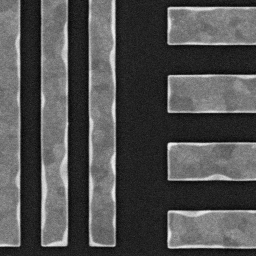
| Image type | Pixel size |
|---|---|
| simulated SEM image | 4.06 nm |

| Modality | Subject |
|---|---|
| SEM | groups of lines, slits or small figures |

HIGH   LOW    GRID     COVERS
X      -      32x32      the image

XX---XXX---XXX------------------
XX---XXX---XXX-------XXXXXXXXXXX
XX---XXX---XXX-------XXXXXXXXXXX
XX---XXX---XXX-------XXXXXXXXXXX
XX---XXX---XXX-------XXXXXXXXXXX
XX---XXX---XXX-------XX--XX-XXXX
XX---XXX---XXX------------------
XX---XXX---XXX------------------
XX---XXX---XXX------------------
XX---XXX---XXX-------XXXXXXXXX--
XX---XXX---XXX-------XXXXXXXXXXX
XX---XXX---XXX-------XXXXXXXXXXX
XX---XXX---XXX-------XXXXXXXXXXX
XX---XXX---XXX-------XXXXXXXXXXX
XX---XXX---XXX------------------
XX---XXX---XXX------------------
XX---XXX---XXX------------------
XX---XXX---XXX------------------
XX---XXX---XXX-------XXXXXXXXXXX
XX---XXX---XXX-------XXXXXXXXXXX
XX---XXX---XXX-------XXXXXXXXXXX
XX---XXX---XXX-------XXXXXXXXXXX
XX---XXX---XXX-------XXX-----XXX
XX---XXX---XXX------------------
XX---XXX---XXX------------------
XX---XXX---XXX------------------
XX---XXX---XXX-------XX--XXXXXXX
XX---XXX---XXX-------XXXXXXXXXXX
XX---XXX---XXX-------XXXXXXXXXXX
XX---XXX---XXX-------XXXXXXXXXXX
XX---XX-----XX-------XXXXXXXXXXX
--------------------------------